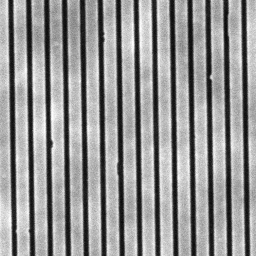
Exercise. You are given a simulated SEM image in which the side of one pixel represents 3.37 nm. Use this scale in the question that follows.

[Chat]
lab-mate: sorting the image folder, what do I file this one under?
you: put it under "parallel lines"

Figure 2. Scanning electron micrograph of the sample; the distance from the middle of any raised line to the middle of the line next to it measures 60.4 nanometers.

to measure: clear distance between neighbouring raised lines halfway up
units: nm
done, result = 19.8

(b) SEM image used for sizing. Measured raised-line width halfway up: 40 nm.